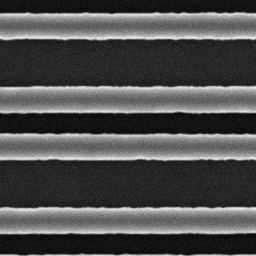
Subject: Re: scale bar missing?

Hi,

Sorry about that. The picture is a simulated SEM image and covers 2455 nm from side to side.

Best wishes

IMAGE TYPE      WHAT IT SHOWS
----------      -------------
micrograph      lines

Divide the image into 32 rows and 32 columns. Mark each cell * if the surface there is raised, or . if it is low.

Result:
................................
................................
********************************
********************************
********************************
................................
................................
................................
................................
................................
................................
********************************
********************************
********************************
................................
................................
................................
********************************
********************************
********************************
................................
................................
................................
................................
................................
................................
********************************
********************************
********************************
................................
................................
................................